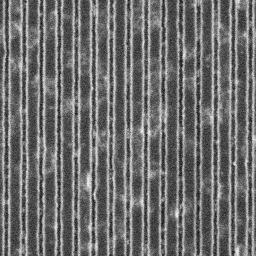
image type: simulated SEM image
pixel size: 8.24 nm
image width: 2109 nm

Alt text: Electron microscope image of parallel lines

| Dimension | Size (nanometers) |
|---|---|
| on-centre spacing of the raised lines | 144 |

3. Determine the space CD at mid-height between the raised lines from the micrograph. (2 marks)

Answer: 36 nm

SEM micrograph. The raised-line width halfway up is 0.108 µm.